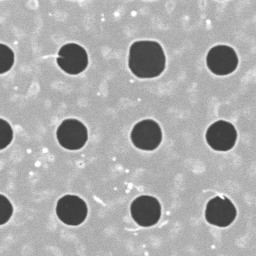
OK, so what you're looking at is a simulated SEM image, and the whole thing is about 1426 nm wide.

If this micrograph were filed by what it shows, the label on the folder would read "a regular array of holes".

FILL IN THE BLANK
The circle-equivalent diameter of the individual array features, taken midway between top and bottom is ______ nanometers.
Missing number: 173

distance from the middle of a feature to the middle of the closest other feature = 0.415 microns